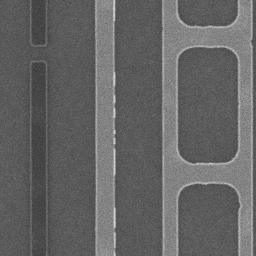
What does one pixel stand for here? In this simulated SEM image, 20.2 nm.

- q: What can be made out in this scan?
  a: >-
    one or a few lines or trenches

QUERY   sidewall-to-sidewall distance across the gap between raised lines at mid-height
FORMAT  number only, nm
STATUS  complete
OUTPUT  1010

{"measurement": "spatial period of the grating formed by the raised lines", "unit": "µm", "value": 1.39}